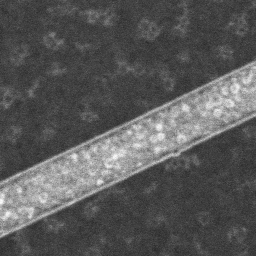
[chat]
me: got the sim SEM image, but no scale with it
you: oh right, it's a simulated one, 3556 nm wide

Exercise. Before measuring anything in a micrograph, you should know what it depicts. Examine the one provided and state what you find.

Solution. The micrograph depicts one or a few lines or trenches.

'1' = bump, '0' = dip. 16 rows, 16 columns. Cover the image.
1111111111111111
1111111111111111
1111111111111111
1111111111111111
1111111111111110
1111111111111000
1111111111100000
1111111100000001
1111110000000111
1111000000011111
1100000001111111
0000000111111111
0000011111111111
0001111111111111
0111111111111111
1111111111111111